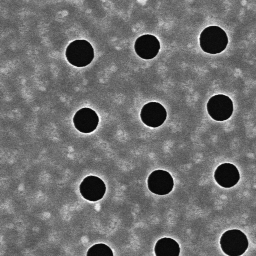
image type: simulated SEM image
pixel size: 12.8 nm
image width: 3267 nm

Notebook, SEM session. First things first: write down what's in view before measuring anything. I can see a regular array of holes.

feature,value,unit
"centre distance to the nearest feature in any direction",857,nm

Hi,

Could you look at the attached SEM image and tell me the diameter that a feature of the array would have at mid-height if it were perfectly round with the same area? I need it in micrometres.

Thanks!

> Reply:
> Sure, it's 0.332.